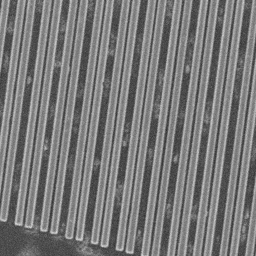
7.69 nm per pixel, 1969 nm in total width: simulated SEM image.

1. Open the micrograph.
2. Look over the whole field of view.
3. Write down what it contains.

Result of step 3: parallel lines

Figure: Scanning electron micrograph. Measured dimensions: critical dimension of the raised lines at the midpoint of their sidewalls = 0.0457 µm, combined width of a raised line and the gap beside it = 99.1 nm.